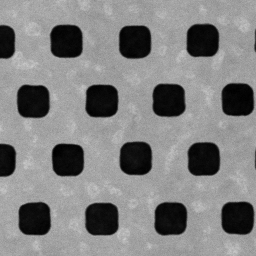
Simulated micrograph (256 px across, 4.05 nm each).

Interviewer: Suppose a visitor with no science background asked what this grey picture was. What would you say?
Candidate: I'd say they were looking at a regular array of holes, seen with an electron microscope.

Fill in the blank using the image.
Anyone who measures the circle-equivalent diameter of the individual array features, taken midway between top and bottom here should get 141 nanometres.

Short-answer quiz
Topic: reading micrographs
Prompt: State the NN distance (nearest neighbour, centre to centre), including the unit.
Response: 273 nm